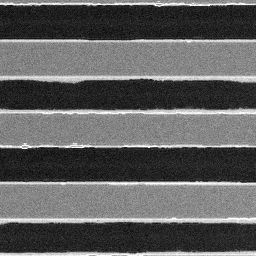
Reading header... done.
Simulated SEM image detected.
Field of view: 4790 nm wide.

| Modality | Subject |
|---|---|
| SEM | lines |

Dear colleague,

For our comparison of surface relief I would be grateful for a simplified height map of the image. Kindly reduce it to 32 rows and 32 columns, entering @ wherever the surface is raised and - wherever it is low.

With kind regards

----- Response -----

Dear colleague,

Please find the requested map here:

@@@@@@@@@--@@@@@@@@@@@@@@@@@@@@@
--------------------------------
--------------------------------
--------------------------------
--------------------------------
@@@@@@@@@@@@@@@@@@@@@@@@@@@@@@@@
@@@@@@@@@@@@@@@@@@@@@@@@@@@@@@@@
@@@@@@@@@@@@@@@@@@@@@@@@@@@@@@@@
@@@@@@@@@@@@@@@@@@@@@@@@@@@@@@@@
@@@@@@@@@@@@@@@@@@@@@@@@@@@@@@@@
--------------------------------
--------------------------------
--------------------------------
--------------------------------
@@@@@@@@@@@@@@@@@@@@@@@@@@@@@@@@
@@@@@@@@@@@@@@@@@@@@@@@@@@@@@@@@
@@@@@@@@@@@@@@@@@@@@@@@@@@@@@@@@
@@@@@@@@@@@@@@@@@@@@@@@@@@@@@@@@
---@----------------------------
--------------------------------
--------------------------------
--------------------------------
--------------------------------
@@@@@@@@@@@@@@@@@@@@@@@@@@@@@@@@
@@@@@@@@@@@@@@@@@@@@@@@@@@@@@@@@
@@@@@@@@@@@@@@@@@@@@@@@@@@@@@@@@
@@@@@@@@@@@@@@@@@@@@@@@@@@@@@@@@
--------------------------------
--------------------------------
--------------------------------
--------------------------------
--------------------------------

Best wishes